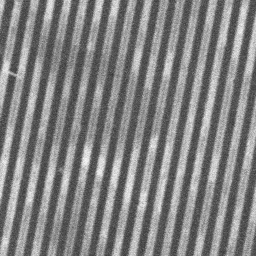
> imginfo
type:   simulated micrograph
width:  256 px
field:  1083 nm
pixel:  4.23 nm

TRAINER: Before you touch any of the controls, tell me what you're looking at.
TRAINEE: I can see parallel lines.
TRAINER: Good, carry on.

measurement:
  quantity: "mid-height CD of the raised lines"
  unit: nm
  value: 26.4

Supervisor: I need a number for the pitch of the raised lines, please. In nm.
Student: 67.4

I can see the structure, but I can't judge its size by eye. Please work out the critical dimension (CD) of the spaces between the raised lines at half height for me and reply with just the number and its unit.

42.1 nm